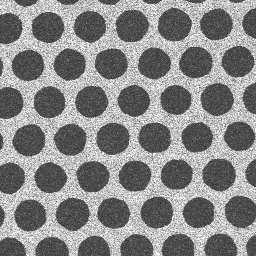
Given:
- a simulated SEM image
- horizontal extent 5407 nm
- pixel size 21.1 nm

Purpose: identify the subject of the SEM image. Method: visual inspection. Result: a regular array of holes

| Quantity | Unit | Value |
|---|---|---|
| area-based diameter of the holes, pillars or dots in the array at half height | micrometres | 0.676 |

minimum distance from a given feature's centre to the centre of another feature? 883 nm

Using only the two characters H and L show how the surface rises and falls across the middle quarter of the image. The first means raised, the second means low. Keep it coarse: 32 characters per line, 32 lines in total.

LLLLLHHHLLLLLLLLHHLLLLLLLLLHHLLL
LLLLLHHHLLLLLLLLHHHLLLLLLLLHHLLL
LLLLLHHHHLLLLLLHHHHLLLLLLLHHHHLL
LLLLHHHHHHLLLLHHHHHHHLLLHHHHHHHH
HHHHHHHHHHHHHHHHHHHHHHHHHHHHHHHH
HHHHHHLLLHHHHHHHLLLHHHHHHHHLLHHH
HHHHLLLLLLHHHHHLLLLLHHHHHLLLLLLH
HHHLLLLLLLLHHHLLLLLLLHHHLLLLLLLL
HHHLLLLLLLLHHLLLLLLLLHHHLLLLLLLL
HHHLLLLLLLLHHLLLLLLLLLHHLLLLLLLL
HHHLLLLLLLLHHHLLLLLLLHHHLLLLLLLL
HHHLLLLLLLHHHHLLLLLLLHHHHLLLLLLH
HHHHLLLLLLHHHHHLLLLLHHHHHHLLLHHH
HHHHHHHHHHHHHHHHHHHHHHHHHHHHHHHH
HHHHHHHHHHHHHHHHHHHHHHHHHHHHHHHH
LLLLHHHHHHLLLLLHHHHHLLLLLHHHHHHL
LLLLLHHHHLLLLLLLHHHLLLLLLLHHHHLL
LLLLLHHHLLLLLLLLHHHLLLLLLLLHHLLL
LLLLLLHHLLLLLLLLHHLLLLLLLLLHHLLL
LLLLLLHHLLLLLLLLHHHLLLLLLLLHHHLL
LLLLLHHHLLLLLLLLHHHLLLLLLLHHHHLL
LLLLLHHHHLLLLLLHHHHHLLLLLLHHHHHL
LLLHHHHHHHHLLHHHHHHHHHHHHHHHHHHH
HHHHHHHHHHHHHHHHHHHHHHHHHHHHHHHH
HHHHHHLLLHHHHHHHLLLLHHHHHHLLLLLH
HHHHLLLLLLHHHHHLLLLLLHHHHLLLLLLL
HHHLLLLLLLLHHHLLLLLLLLHHLLLLLLLL
LHHLLLLLLLLHHHLLLLLLLLHHLLLLLLLL
LHHLLLLLLLLHHHLLLLLLLLHHLLLLLLLL
LHHHLLLLLLLHHHLLLLLLLHHHHLLLLLLL
HHHHLLLLLLHHHHHLLLLLLHHHHLLLLLLH
HHHHHLLLLHHHHHHHLLLLHHHHHHHHHHHH